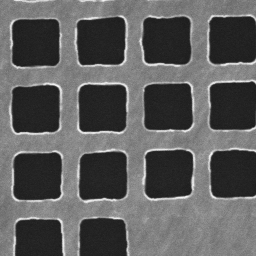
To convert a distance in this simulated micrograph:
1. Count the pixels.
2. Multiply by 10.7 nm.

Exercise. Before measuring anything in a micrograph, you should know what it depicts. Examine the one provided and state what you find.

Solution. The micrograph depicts a regular array of holes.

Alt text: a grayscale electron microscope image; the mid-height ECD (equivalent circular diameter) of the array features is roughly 0.564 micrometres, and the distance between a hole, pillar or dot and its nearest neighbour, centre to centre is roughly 700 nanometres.